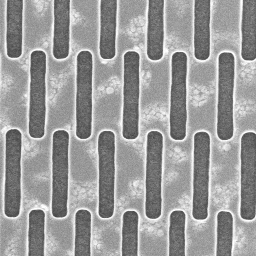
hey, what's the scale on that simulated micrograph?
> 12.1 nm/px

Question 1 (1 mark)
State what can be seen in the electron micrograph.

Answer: a regular array of holes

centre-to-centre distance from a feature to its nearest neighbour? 570 nm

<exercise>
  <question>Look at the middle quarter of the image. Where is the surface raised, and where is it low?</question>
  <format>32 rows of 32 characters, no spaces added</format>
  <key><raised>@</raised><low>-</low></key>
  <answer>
@@@----@@@@@@@@----@@@@@@@@----@
@@@----@@@@@@@@----@@@@@@@@----@
@@@----@@@@@@@@----@@@@@@@@----@
@@@----@@@@@@@@----@@@@@@@@----@
@@@----@@@@@@@@----@@@@@@@@----@
@@@----@@@@@@@@----@@@@@@@@----@
@@@----@@@@@@@@----@@@@@@@-----@
@@@----@@@@@@@@----@@@@@@@-----@
@@@----@@@@@@@@----@@@@@@@-----@
@@@----@@@@@@@@----@@@@@@@-----@
@@@----@@@@@@@@----@@@@@@@-----@
@@@----@@@@@@@@----@@@@@@@-----@
@@@----@@@@@@@@----@@@@@@@-----@
@@@----@@@@@@@@----@@@@@@@-----@
@@@----@@@@@@@@----@@@@@@@-----@
@@@----@@@@@@@@----@@@@@@@-----@
@@@----@@@@@@@@----@@@@@@@-----@
-@@----@@----@@----@@---@@-----@
-@@@--@@@----@@---@@@----@@---@@
-@@@@@@@-----@@@@@@@@----@@@@@@@
-@@@@@@@-----@@@@@@@@----@@@@@@@
-@@@@@@@-----@@@@@@@-----@@@@@@@
-@@@@@@@@----@@@@@@@@----@@@@@@@
-@@@@@@@@----@@@@@@@@----@@@@@@@
-@@@@@@@@----@@@@@@@-----@@@@@@@
-@@@@@@@@----@@@@@@@-----@@@@@@@
-@@@@@@@@----@@@@@@@-----@@@@@@@
-@@@@@@@@----@@@@@@@-----@@@@@@@
-@@@@@@@-----@@@@@@@-----@@@@@@@
-@@@@@@@-----@@@@@@@-----@@@@@@@
-@@@@@@@-----@@@@@@@-----@@@@@@@
-@@@@@@@-----@@@@@@@----@@@@@@@@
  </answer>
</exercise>